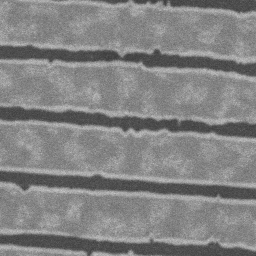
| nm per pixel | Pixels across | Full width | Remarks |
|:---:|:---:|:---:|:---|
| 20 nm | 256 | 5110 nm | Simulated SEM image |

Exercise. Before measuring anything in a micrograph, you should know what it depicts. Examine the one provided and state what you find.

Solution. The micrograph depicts one or a few lines or trenches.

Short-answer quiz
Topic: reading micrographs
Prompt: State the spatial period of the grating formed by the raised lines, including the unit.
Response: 1250 nm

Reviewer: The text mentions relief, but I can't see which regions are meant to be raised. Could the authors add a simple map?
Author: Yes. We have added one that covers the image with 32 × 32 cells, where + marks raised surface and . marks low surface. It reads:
++++++++++++....+...............
++++++++++++++++++++++++++++....
++++++++++++++++++++++++++++++++
++++++++++++++++++++++++++++++++
++++++++++++++++++++++++++++++++
..+.++++++++++++++++++++++++++++
...............+..+.++++++++++++
................................
++++++++++++++++++..............
++++++++++++++++++++++++++++++..
++++++++++++++++++++++++++++++++
++++++++++++++++++++++++++++++++
++++++++++++++++++++++++++++++++
......+..+++++++++++++++++++++++
..................++++++++++++++
++++++..........................
+++++++++++++++.....+...........
++++++++++++++++++++++++++++++..
++++++++++++++++++++++++++++++++
++++++++++++++++++++++++++++++++
++++++++++++++++++++++++++++++++
........++++++++++++++++++++++++
....................++++++++++++
++..............................
+++++++++++++++++++.............
++++++++++++++++++++++++++++++++
++++++++++++++++++++++++++++++++
++++++++++++++++++++++++++++++++
++++++++++++++++++++++++++++++++
.........+++++++++++++++++++++++
............................++++
+++++++.........................